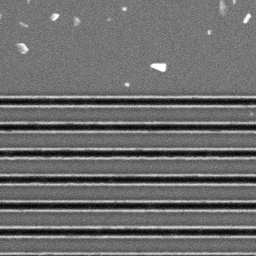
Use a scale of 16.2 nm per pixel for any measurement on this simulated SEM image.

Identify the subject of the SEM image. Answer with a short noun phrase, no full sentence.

parallel lines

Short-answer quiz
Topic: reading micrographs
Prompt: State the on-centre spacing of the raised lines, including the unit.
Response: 421 nm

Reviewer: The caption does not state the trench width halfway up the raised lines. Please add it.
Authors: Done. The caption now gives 251 nanometres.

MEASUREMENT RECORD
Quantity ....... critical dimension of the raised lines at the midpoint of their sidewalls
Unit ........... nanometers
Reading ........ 172